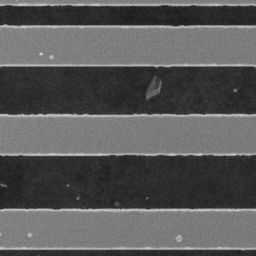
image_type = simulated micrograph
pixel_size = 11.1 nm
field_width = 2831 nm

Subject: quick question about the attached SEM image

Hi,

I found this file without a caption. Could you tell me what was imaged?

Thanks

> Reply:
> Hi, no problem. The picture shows lines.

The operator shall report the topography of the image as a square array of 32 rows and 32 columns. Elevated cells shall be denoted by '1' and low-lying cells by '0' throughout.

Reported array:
11111111111111111111111111111111
00000000000000000000000000000000
00000000000000000000000000000000
11111111111111111111111111111111
11111111111111111111111111111111
11111111111111111111111111111111
11111111111111111111111111111111
11111111111111111111111111111111
00000000000000000000000000000000
00000000000000000000000000000000
00000000000000000000000000000000
00000000000000000000000000000000
00000000000000000000000000000000
00000000000000000000000000000000
11111111111111111111111111111111
11111111111111111111111111111111
11111111111111111111111111111111
11111111111111111111111111111111
11111111111111111111111111111111
00000000000000000000000000000000
00000000000000000000000000000000
00000000000000000000000000000000
00000000000000000000000000000000
00000000000000000000000000000000
00000000000000000000000000000000
00000000000000000000000000000000
11111111111111111111111111111111
11111111111111111111111111111111
11111111111111111111111111111111
11111111111111111111111111111111
11111111111111111111111111111111
00000000000000000000000000000000